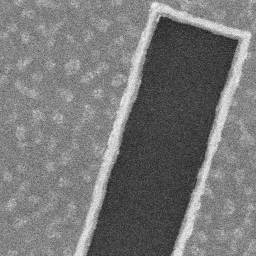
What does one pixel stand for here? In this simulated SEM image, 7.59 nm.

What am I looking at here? one or a few lines or trenches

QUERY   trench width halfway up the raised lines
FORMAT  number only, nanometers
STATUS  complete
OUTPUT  727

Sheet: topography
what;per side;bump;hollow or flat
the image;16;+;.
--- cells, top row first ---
++++++++++++++++
+++++++++....+++
+++++++++......+
+++++++++......+
++++++++.......+
++++++++......++
++++++++......++
++++++++......++
+++++++......+++
+++++++......+++
+++++++......+++
++++++.......+++
++++++......++++
++++++......++++
+++++.......++++
+++++......+++++